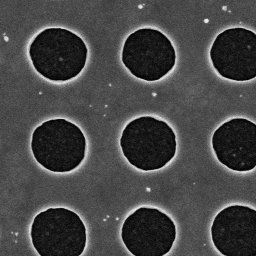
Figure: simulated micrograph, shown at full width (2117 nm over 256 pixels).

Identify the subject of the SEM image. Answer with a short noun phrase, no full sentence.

holes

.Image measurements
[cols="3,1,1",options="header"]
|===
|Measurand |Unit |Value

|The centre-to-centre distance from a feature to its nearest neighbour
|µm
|0.735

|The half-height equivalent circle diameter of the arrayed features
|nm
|452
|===